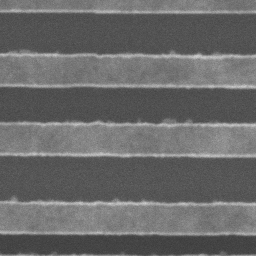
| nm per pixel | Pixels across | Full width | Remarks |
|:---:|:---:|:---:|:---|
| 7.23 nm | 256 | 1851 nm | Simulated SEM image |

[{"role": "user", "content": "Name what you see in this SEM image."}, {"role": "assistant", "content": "lines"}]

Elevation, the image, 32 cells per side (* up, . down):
********************************
...........*********************
................................
................................
................................
................................
................................
********************************
********************************
********************************
********************************
................................
................................
................................
................................
*******************.*.**********
********************************
********************************
********************************
...............**..**.**********
................................
................................
................................
................................
................................
********************************
********************************
********************************
********************************
................................
................................
................................